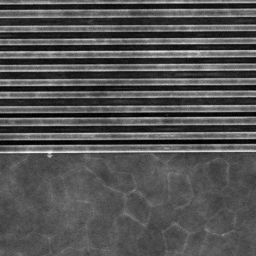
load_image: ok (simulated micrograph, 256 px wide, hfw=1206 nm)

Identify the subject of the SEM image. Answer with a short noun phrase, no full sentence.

parallel lines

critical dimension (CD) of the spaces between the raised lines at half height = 0.0318 micrometres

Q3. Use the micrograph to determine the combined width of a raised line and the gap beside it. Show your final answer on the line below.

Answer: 63.6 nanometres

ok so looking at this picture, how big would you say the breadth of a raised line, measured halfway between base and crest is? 0.0312 micrometres